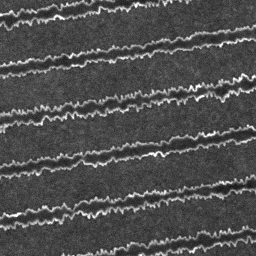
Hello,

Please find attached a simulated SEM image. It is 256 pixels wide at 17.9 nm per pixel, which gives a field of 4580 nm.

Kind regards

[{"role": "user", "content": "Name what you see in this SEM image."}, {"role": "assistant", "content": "parallel lines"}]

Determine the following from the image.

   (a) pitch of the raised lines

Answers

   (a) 0.889 um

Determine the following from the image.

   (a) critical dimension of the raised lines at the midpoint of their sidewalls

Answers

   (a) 223 nm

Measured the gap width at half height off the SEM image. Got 661 nanometres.